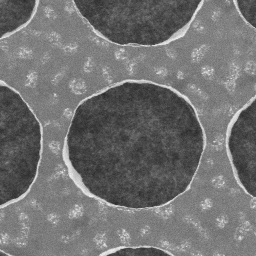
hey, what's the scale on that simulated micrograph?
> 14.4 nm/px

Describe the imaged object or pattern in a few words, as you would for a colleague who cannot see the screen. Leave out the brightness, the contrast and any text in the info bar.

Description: holes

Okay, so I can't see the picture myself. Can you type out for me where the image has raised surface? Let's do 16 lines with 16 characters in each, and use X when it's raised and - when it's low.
--XXX-------XXX-
-XXXXX------XXXX
XXXXXXX----XXXXX
XXXXXXXXXXXXXXXX
XXXXXXXXXXXXXXXX
-XXXXXX---XXXXXX
--XXX-------XXXX
--XXX-------XXX-
---X---------X--
--XX---------X--
--XXX-------XXX-
--XXX-------XXX-
-XXXXX-----XXXXX
XXXXXXXXXXXXXXXX
XXXXXXXXXXXXXXXX
XXXXXXXX-XXXXXXX